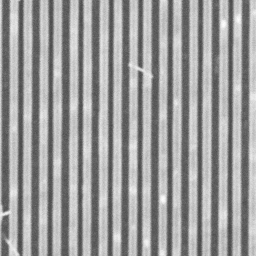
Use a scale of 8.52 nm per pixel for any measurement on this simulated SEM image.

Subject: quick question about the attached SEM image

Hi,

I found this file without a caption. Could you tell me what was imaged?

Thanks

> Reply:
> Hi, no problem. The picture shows parallel lines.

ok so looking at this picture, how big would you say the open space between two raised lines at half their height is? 65 nm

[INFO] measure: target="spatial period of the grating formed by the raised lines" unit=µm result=0.127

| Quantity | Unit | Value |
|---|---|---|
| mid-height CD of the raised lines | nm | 66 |